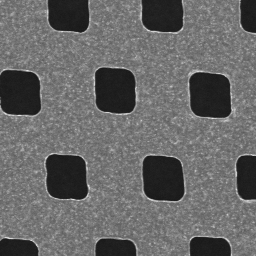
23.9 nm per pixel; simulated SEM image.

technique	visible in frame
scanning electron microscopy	holes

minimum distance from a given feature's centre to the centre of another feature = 2.28 micrometres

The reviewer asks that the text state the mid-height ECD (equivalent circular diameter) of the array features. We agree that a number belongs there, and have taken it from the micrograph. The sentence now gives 1120 nm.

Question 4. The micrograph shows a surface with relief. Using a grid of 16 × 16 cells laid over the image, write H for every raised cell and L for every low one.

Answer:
HHHLLLHHHLLHHHHL
HHHLLHHHHLLHHHHL
HHHHHHHHHHHHHHHH
HHHHHHHHHHHHHHHH
LLHHHHLLHHHHHHHH
LLLHHHLLHHHHLLHH
LLLHHHLLHHHHLLHH
HHHHHHHHHHHHHHHH
HHHHHHHHHHHHHHHH
HHHHHHHHHHHHHHHH
HHHLLHHHHLLHHHHL
HHHLLHHHHLLHHHHL
HHHHHHHHHHLHHHHH
HHHHHHHHHHHHHHHH
HHHHHHHHHHHHHHHH
LLHHHHLLHHHHLLHH